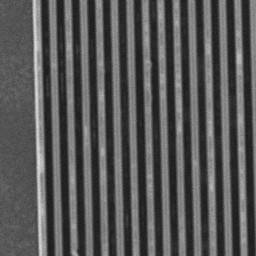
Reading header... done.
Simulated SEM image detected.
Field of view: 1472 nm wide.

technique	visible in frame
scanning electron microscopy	parallel lines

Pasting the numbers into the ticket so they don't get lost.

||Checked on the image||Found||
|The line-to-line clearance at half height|51.8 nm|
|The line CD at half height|34.5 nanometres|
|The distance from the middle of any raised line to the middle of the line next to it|88.8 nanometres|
